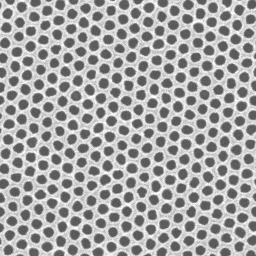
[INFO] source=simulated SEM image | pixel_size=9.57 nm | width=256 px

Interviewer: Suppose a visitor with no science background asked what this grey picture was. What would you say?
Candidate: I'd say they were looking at a regular array of holes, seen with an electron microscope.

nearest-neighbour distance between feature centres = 14 px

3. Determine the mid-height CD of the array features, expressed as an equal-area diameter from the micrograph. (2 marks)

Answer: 102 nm